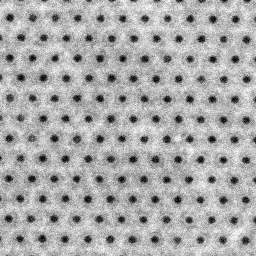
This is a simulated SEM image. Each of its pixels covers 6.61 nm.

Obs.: a regular array of holes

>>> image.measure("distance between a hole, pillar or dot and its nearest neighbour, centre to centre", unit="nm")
148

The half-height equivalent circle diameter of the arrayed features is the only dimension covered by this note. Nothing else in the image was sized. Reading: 0.0609 um